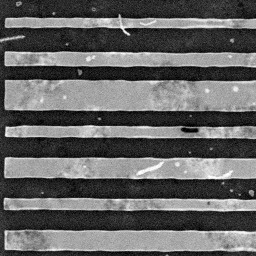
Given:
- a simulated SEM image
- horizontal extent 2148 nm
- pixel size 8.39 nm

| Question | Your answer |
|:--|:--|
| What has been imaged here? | groups of lines, slits or small figures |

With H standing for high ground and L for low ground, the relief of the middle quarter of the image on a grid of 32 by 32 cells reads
LLHLLLHHLLLLHHHHHHLLLHHHHHLHHLLL
LLLLLLLLLLLLLLLLLLLLLLLLLLLLLLLL
LLLLLLLLLLLLLLLLLLLLLLLLLLLLLLLL
LLLLLLLLLLLLLLLLLLLLLLLLLLLLLLLL
HHHHHHHHHHHHHHHHHHHHHHHHHHHHHHHL
HHHHHHHHHHHHHHHHHHHHHHHHHHHHHHHH
HHHHHHHHHHHHHHHHHHHHHHHHHHHHHHHH
HHHHHHHHHHHHHHHHHHHHHHHHHHHHHHHH
HHHHHHHHHHHHHHHHHHHHHHHHHHHHHHHH
HHHHHHHHHHHHHHHHHHHHHHHHHHHHHHHH
HHHHHHHHHHHHHHHHHHHHHHHHHHHHHHHH
LHHHHHHHHHHHHHHHHHHHHHHHHHHHHHHH
LLLLLLLLLLLLLLLLLLLLLLLLLLLLLLLL
LLLLLLLLLLLLLLLLLLLLLLLLLLLLLLLL
LLLLLLLLLLLLLLLLLLLLLLLLLLLLLLLL
LLLLLLLLLLLLLLLLLLLLLLLLLLLLLLLL
HHHHHHHHHHHHHHHHHHHHHHHHHHHHHHHH
HHHHHHHHHHHHHHHHHHHHHHHHHHHHHHHH
LLLLLLLLLLLLLLLLLLLLLLLLLLLLLLLL
LLLLLLLLLLLLLLLLLLLLLLLLLLLLLLLL
LLLLLLLLLLLLLLLLLLLLLLLLLLLLLLLL
LLLLLLLLLLLLLLLLLLLLLLLLLLLLLLLL
LLLLLLLLLLLLLLLLLLLLLLLLLLLLLLLL
LLLLLLLLLLLLLLLLLLLLLLLLLLLLLLLL
HHHHHHHHHHHHHHHHHHHHHHHHHHHHHHHH
HHHHHHHHHHHHHHHHHHHHHHHHHHHHHHHH
HHHHHHHHHHHHHHHHHHHHHHHHHHHHHHHH
HHHHHHHHHHHHHHHHHHHHHHHHHHHHHHHH
LLLLLLLLLLLLLLLLHHHHLLHHLLLLHHHH
LLLLLLLLLLLLLLLLLLLLLLLLLLLLLLLL
LLLLLLLLLLLLLLLLLLLLLLLLLLLLLLLL
LLLLLLLLLLLLLLLLLLLLLLLLLLLLLLLL